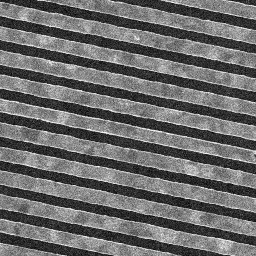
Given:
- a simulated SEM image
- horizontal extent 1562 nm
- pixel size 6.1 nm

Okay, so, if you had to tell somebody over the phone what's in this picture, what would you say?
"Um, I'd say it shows parallel lines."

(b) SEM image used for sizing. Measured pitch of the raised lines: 144 nanometres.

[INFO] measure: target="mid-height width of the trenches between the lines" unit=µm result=0.0598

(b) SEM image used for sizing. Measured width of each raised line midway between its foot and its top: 84.5 nm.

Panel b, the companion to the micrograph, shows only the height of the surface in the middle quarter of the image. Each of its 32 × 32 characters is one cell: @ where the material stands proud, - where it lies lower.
@@@-------------@@@@@@@@@@@@@@@@
@@@@@@@@-------------@@@@@@@@@@@
@@@@@@@@@@@@@-------------@@@@@@
-@@@@@@@@@@@@@@@@@-------------@
------@@@@@@@@@@@@@@@@@---------
-----------@@@@@@@@@@@@@@@@@----
@@@-------------@@@@@@@@@@@@@@@@
@@@@@@@@-------------@@@@@@@@@@@
@@@@@@@@@@@@@-------------@@@@@@
-@@@@@@@@@@@@@@@@@-------------@
------@@@@@@@@@@@@@@@@@---------
-----------@@@@@@@@@@@@@@@@@----
@@--------------@@@@@@@@-@@@@@@@
@@@@@@@--------------@@@@@@@@@@@
@@@@@@@@@@@@@-------------@@@@@@
-@@@@@@@@@@@@@@@@--------------@
-------@@@@@@@@@@@@@@@----------
------------@@@@@@@@@@@@@@@-----
@@@--------------@@@@@@@@@@@@@@@
@@@@@@@@--------------@@@@@@@@@@
@@@@@@@@@@@@@--------------@@@@@
@@@@@@@@@@@@@@@@@@-------------@
-----@@@@@@@@@@@@@@@@@@@--------
-----------@@@@@@@@@@@@@@@@@----
@@@-------------@@@@@@@@@@@@@@@@
@@@@@@@@------------@@@@@@@@@@@@
@@@@@@@@@@@@@-----------@@@@@@@@
-@@@@@@@@@@@@@@@@@------------@@
------@@@@@@@@@@@@@@@@----------
-----------@@@@@@@@@@@@@@@@@----
@@@-------------@@@@@@@@@@@@@@@@
@@@--@@@-------------@@@@@@@@@@@